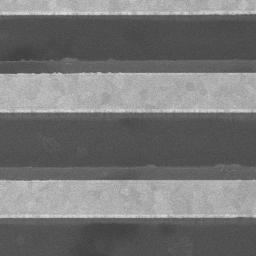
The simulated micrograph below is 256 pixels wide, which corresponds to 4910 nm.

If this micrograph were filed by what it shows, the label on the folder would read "lines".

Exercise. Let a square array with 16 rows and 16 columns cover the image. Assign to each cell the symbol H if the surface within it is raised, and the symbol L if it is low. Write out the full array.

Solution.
HHHHHHHHHHHHHHHH
LLLLLLLLLLLLLLLL
LLLLLLLLLLLLLLLL
LLLLLLLLLLLLLLLL
HHHHHHHHHHHHHHHH
HHHHHHHHHHHHHHHH
HHHHHHHHHHHHHHHH
LLLLLLLLLLLLLLLL
LLLLLLLLLLLLLLLL
LLLLLLLLLLLLLLLL
LHLLLLLLLHLLLHHH
HHHHHHHHHHHHHHHH
HHHHHHHHHHHHHHHH
HHHHHHHHHHHHHHHH
LLLLLLLLLLLLLLLL
LLLLLLLLLLLLLLLL